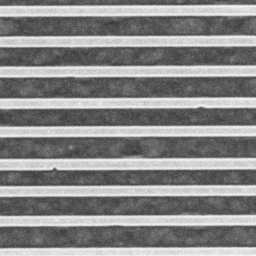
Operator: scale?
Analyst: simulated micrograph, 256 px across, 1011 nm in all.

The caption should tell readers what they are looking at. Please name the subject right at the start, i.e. parallel lines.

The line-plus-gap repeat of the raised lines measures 118 nanometres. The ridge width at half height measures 0.0355 um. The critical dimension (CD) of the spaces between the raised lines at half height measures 21.4 pixels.